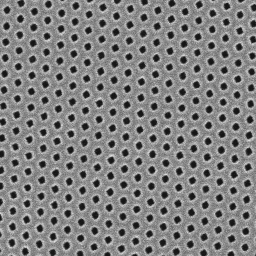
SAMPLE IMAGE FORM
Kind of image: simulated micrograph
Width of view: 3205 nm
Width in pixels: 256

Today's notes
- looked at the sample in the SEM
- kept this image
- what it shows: a regular array of holes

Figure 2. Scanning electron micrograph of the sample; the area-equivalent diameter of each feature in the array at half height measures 94.8 nm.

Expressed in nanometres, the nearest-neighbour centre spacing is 196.